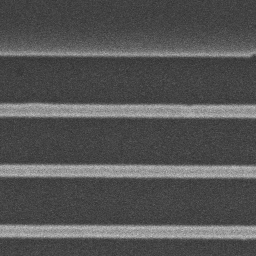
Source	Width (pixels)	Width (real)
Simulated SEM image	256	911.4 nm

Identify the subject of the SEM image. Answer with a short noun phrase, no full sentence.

parallel lines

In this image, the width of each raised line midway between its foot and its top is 0.0391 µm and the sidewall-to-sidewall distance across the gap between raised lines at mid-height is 176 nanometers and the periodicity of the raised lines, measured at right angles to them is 215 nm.